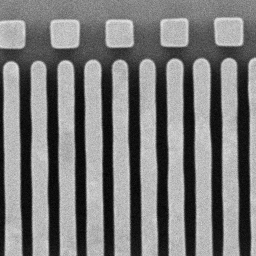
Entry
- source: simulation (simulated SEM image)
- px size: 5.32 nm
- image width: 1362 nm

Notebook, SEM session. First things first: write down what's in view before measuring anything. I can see groups of lines, slits or small figures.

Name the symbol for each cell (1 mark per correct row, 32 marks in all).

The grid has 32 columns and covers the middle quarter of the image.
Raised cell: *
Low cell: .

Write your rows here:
**...****...****...****...****..
**...****...****...****...****..
**...****...****...****...****..
***..****...****...****...****..
***..****...****...****...****..
***..****...****...****...****..
***..****...****...****...****..
***..****...****...****...****..
***..****...****...****...****..
***..****...****...****...****..
***..****...****...****...****..
***..****...****...****...****..
***..****...****...****...****..
***..****...****...****...****..
***..****...****...****...****..
***..****...****...****...****..
***..****...****...****...****..
***..****...****...****...****..
***..*****..****...****...****..
***..*****..****...****...****..
***...****..****...****...****..
***...****..****...****...****..
***...***...****...****...****..
***...***...****...****...****..
***...***...****...****...****..
***...***...****...****...****..
***...***...****...****...****..
***...***...****...****...****..
***...***...****...****...****..
***...***...****...****...****..
***...****...***...****...****..
***...****...***...****...****..